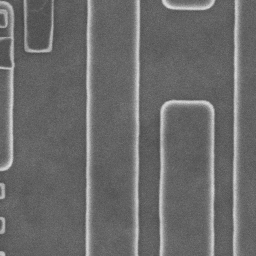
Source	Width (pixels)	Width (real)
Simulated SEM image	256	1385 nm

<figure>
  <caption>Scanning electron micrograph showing wiring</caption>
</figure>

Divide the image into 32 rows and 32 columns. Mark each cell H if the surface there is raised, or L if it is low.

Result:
HLLHHHHLLLLHHHHHHLLLLHHHHHHLLLHH
HHLHHHHLLLLHHHHHHLLLLLLLLLLLLLHH
HHLHHHHLLLLHHHHHHLLLLLLLLLLLLLHH
HHLHHHLLLLLHHHHHHLLLLLLLLLLLLHHH
HHLHHHLLLLLHHHHHHLLLLLLLLLLLLHHH
HHLHHHLLLLLHHHHHHLLLLLLLLLLLLHHH
HHLLLLLLLLLHHHHHHLLLLLLLLLLLLHHH
HHLLLLLLLLLHHHHHHLLLLLLLLLLLLHHH
HHLLLLLLLLLHHHHHHLLLLLLLLLLLLHHH
HHLLLLLLLLLHHHHHHLLLLLLLLLLLLHHH
HHLLLLLLLLLHHHHHHLLLLLLLLLLLLHHH
HHLLLLLLLLLHHHHHHLLLLLLLLLLLLHHH
HHLLLLLLLLLHHHHHHLLLLLLLLLLLLHHH
HHLLLLLLLLLHHHHHHLLLHHHHHHHLLHHH
HLLLLLLLLLLHHHHHHLLLHHHHHHHLLHHH
HLLLLLLLLLLHHHHHHLLLHHHHHHHLLHHH
HLLLLLLLLLLHHHHHHLLLHHHHHHHLLHHH
HHLLLLLLLLLHHHHHHLLLHHHHHHHLLHHH
HHLLLLLLLLLHHHHHHLLLHHHHHHHLLHHH
HHLLLLLLLLLHHHHHHLLLHHHHHHHLLHHH
HLLLLLLLLLLHHHHHHLLLHHHHHHHLLHHH
LLLLLLLLLLLHHHHHHLLLHHHHHHHLLHHH
LLLLLLLLLLLHHHHHHLLLHHHHHHHLLHHH
LLLLLLLLLLLHHHHHHLLLHHHHHHHLLHHH
LLLLLLLLLLLHHHHHHLLLHHHHHHHLLHHH
LLLLLLLLLLLHHHHHHLLLHHHHHHHLLHHH
LLLLLLLLLLLHHHHHHLLLHHHHHHHLLHHH
LLLLLLLLLLLHHHHHHLLLHHHHHHHLLHHH
LLLLLLLLLLLHHHHHHLLLHHHHHHHLLHHH
LLLLLLLLLLLHHHHHHLLLHHHHHHHLLHHH
LLLLLLLLLLLHHHHHHLLLHHHHHHHLLHHH
LLLLLLLLLLLHHHHHHLLLHHHHHHHLLHHH